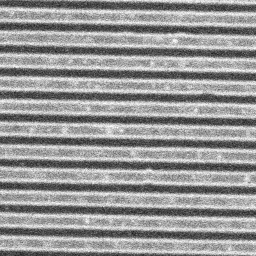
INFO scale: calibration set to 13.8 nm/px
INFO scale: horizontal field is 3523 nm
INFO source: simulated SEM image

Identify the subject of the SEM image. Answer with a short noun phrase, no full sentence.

parallel lines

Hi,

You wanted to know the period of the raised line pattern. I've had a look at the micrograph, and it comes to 314 nm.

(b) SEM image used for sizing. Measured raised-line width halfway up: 172 nm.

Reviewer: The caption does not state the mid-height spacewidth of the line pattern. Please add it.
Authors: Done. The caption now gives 9.88 pixels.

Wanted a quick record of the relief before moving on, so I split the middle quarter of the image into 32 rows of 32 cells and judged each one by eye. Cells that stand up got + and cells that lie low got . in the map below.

++++++++++++++++++++++++++++++++
......................+.........
................................
................................
++++++++++++++++++++++++++++++++
++++++++++++++++++++++++++++++++
++++++++++++++++++++++++++++++++
................................
................................
.++++...++......................
++++++++++++++++++++++++++++++++
++++++++++++++++++++++++++++++++
.....+++++++++++++++++++++++++++
................................
................................
+++++++++++++++++++++..+++......
++++++++++++++++++++++++++++++++
++++++++++++++++++++++++++++++++
...........................+++++
................................
................................
++++++++++++++++++++++++++++++++
++++++++++++++++++++++++++++++++
++++++++++++++++++++++++++++++++
................................
................................
++++.................+..........
++++++++++++++++++++++++++++++++
++++++++++++++++++++++++++++++++
.++++....+++++++++++++++++++++++
................................
................................